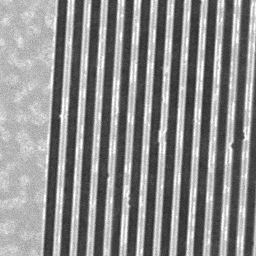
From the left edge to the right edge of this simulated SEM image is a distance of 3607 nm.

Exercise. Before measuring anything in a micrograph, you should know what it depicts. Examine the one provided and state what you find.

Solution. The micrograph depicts parallel lines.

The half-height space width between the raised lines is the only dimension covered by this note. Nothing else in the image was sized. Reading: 137 nm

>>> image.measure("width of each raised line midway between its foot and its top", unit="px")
6.86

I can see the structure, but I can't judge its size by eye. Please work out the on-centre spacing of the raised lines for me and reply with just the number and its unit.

234 nanometres